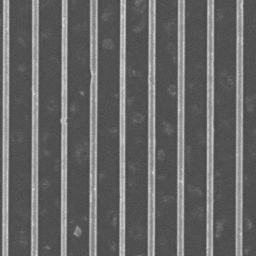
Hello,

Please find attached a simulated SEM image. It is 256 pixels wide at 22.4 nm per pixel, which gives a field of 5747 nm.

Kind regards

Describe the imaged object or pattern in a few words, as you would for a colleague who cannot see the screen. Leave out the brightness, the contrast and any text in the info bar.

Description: parallel lines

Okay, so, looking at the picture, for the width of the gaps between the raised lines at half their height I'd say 533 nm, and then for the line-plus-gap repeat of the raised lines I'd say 656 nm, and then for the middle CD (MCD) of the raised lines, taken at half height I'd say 0.132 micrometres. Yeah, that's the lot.